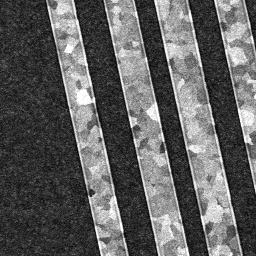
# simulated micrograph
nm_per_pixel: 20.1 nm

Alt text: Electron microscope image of parallel lines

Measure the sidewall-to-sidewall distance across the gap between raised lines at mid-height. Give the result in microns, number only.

0.557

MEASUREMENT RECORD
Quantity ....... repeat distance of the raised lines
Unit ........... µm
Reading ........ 1.1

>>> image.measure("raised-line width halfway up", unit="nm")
572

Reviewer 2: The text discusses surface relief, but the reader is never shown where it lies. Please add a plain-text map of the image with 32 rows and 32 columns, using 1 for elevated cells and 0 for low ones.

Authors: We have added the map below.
00000011100001111000111000011110
00000011100001111000111100011110
00000011110000111000111100011110
00000001110000111000111100001110
00000001110000111100111100001110
00000001110000111100011100001111
00000001110000111100011110001111
00000001111000011100011110001111
00000000111000011100011110000111
00000000111000011110001110000111
00000000111000011110001111000111
00000000111100011110001111000111
00000000011100001110001111000011
00000000011100001111001111000011
00000000011100001111000111000011
00000000011100001111000111100011
00000000011110000111000111100011
00000000001110000111000111100001
00000000001110000111100111100001
00000000001110000111100011110001
00000000001110000111100011110001
00000000001111000011100011110001
00000000000111000011110011110000
00000000000111000011110001110000
00000000000111000011110001111000
00000000000111100001110001111000
00000000000011100001110001111000
00000000000011100001111001111000
00000000000011100001111000111000
00000000000011100001111000111100
00000000000011110000111000111100
00000000000001110000111000111100